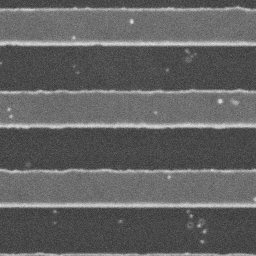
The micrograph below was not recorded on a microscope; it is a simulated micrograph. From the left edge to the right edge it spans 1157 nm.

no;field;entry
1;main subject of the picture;lines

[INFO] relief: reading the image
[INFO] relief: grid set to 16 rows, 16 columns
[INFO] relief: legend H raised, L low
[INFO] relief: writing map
LLLLLLLLLLLLLLHL
HHHHHHHHHHHHHHHH
HHHHHHHHHHHHHHHH
LLLLLLLLLLLLLLLL
LLLLLLLLLLLLLLLL
LLLLLLLLLLLLLLLL
HHHHHHHHHHHHHHHH
HHHHHHHHHHHHHHHH
LLLLLLLLLLLLLLLL
LLLLLLLLLLLLLLLL
LLLLLLLLLLLLLLLL
HHHHHHHHHHHHHHHH
HHHHHHHHHHHHHHHH
LLLLLLLLLLLLLLLL
LLLLLLLLLLLLLLLL
LLLLLLLLLLLLLLLL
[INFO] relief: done